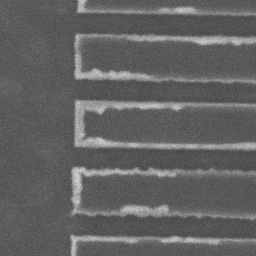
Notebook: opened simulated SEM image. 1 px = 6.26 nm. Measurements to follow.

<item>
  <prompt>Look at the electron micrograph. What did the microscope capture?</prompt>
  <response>one or a few lines or trenches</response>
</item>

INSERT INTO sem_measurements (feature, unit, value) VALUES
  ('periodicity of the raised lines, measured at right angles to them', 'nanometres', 422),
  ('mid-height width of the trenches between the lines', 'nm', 146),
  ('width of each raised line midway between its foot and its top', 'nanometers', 275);